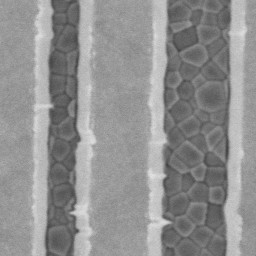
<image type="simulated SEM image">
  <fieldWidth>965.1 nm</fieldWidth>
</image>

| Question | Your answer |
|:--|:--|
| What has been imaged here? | one or a few lines or trenches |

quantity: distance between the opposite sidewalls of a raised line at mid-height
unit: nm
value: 277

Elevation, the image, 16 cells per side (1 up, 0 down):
1110011111000001
1110011111000001
1110011111000001
1110011111000001
1110011111000001
1110011111000001
1110011111000001
1110011111000001
1110011111000001
1110011111000001
1110011111000001
1110011111000001
1110011111000001
1110011111000011
1110011111000001
1110011111000001